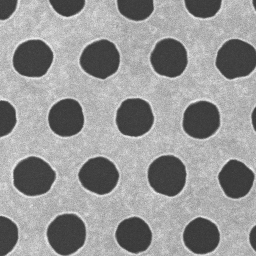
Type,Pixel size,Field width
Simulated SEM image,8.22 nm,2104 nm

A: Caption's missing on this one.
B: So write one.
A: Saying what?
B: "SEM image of a regular array of holes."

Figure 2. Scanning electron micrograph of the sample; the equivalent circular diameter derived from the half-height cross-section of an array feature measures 0.315 micrometres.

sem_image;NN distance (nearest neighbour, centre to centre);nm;548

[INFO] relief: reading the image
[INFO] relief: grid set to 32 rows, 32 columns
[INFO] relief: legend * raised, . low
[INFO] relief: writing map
..****.....****....****.....****
..*****...*****....*****...*****
*****************.**************
********************************
********************************
***...*****...******...*****...*
**.....***.....****....****.....
**.....***.....****....****.....
**....****.....****....****.....
***..*******..******..******...*
********************************
********************************
********.*******..**************
..****....*****....****....*****
..****....*****....****....*****
..****....*****....****....*****
.******...*****...*****....*****
********************************
********************************
********************..**********
**....*****...*****....*****...*
**.....***.....***.....*****....
**.....***.....****....****.....
**....*****...*****....*****...*
*********************.******...*
********************************
********************************
.******...******..******..******
..****.....****....****....*****
..****.....***.....****....****.
..****....*****....****....****.
.******..*******.*******..******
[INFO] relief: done